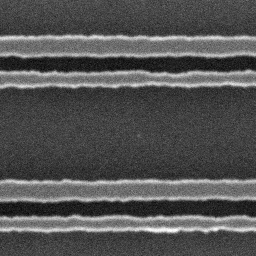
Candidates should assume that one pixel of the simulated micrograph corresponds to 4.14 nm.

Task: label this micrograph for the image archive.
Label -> lines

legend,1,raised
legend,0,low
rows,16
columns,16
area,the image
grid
0000000000000000
0000000000000000
1111111111111111
1111111111111111
1111111111111111
0000000000000000
0000000000000000
0000000000000000
0000000000000000
0000000000000000
0000000000000000
1111111111111111
1111111111111111
1111111111111111
0000000000000000
0000000000000000